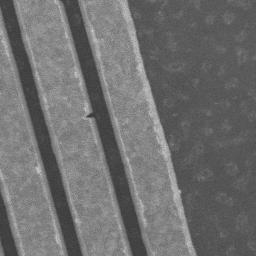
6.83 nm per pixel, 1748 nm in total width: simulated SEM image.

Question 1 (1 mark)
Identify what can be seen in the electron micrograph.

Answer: one or a few lines or trenches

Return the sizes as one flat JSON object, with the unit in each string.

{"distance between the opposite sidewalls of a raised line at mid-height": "292 nm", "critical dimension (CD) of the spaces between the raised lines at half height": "137 nm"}